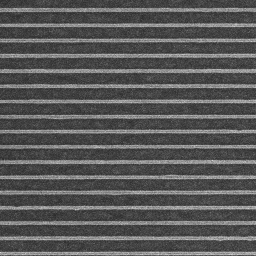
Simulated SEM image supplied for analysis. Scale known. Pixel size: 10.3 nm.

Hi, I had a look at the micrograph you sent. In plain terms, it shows parallel lines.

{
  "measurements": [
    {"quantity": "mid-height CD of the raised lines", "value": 28.4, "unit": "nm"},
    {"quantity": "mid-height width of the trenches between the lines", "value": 124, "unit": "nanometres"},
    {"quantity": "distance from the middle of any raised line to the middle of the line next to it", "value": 157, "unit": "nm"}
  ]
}